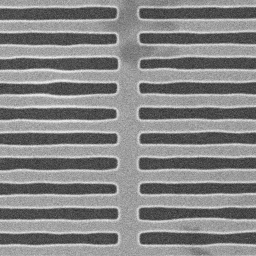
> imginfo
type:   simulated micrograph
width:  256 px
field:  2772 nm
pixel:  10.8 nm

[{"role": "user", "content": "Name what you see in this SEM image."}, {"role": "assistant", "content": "groups of lines, slits or small figures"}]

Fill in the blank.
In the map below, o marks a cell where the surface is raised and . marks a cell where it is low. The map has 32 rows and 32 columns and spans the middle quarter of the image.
..............ooooo.............
.............ooooooo.ooooooo....
oooooooooooooooooooooooooooooooo
oooooooooooooooooooooooooooooooo
.......oooooooooooo.ooooooo.....
.............ooooo..............
.............oooooo.............
.............oooooo.............
oooooooooooooooooooooooooooooooo
oooooooooooooooooooooooooooooooo
oooooooooooooooooooooooooooooooo
.............ooooo..............
.............ooooo..............
.............oooooo.............
oooooooooooooooooooooooooooooooo
oooooooooooooooooooooooooooooooo
oooooooooooooooooooooooooooooooo
.............oooooo.............
..............ooooo.............
.............oooooo.............
oooooooooooooooooooooooooooooooo
oooooooooooooooooooooooooooooooo
oooooooooooooooooooooooooooooooo
.............oooooo.............
..............oooo..............
.............ooooo..............
............ooooooo.............
oooooooooooooooooooooooooooooooo
oooooooooooooooooooooooooooooooo
ooooooooooooooooooooo...oooooooo
.............oooooo.............
.............oooooo.............